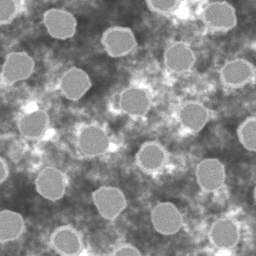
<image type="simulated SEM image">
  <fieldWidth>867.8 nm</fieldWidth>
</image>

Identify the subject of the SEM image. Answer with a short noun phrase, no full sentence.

a regular array of raised bodies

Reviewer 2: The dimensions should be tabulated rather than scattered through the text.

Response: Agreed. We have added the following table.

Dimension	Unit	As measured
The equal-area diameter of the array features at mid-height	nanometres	102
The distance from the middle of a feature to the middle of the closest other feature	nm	200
